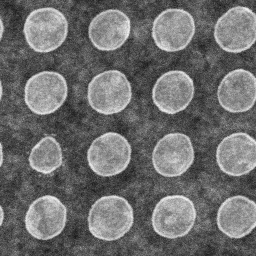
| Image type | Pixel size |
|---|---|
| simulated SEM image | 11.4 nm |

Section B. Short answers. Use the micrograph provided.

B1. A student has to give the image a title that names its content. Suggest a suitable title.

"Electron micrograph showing a regular array of raised bodies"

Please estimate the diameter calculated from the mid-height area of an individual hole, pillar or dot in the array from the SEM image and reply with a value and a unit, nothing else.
467 nm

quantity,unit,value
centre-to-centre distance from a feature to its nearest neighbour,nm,709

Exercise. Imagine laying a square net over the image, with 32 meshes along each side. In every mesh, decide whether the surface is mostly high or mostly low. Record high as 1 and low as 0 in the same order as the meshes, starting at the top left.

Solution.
00000000000000000000000000000000
00001110000001100000011000000110
00011111000011110000111100001111
00011111000111110001111100011111
00011111000111110001111100011111
00001110000011100000111000011110
00000000000000000000000000000000
00000000000000000000000000000000
00000000000000000000000000000000
00000110000011100000111000001110
00011111000111110000111100001111
00011111000111110001111100011111
00011111000111110001111100011111
00001110000011100000111000001110
00000000000000000000000000000000
00000000000000000000000000000000
00000000000000000000000000000000
00000110000011100000111100001111
00001110000111110001111100011111
00001111000111110001111100011111
00001110000111110001111100011111
00000000000011100000111000001110
00000000000000000000000000000000
00000000000000000000000000000000
00000000000000000000000000000000
00001111000011110000111100001111
00001111000111110001111100011111
00011111000111110001111100011111
00001111000111110001111100001111
00001110000011100000010000000100
00000000000000000000000000000000
00000000000000000000000000000000